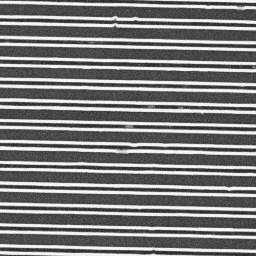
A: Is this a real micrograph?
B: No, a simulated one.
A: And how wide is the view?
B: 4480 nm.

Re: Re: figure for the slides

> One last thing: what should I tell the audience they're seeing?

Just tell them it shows parallel lines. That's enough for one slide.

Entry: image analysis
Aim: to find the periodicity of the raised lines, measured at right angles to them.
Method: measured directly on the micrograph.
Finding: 365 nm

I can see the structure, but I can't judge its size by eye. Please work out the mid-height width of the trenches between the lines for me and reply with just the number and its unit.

236 nanometres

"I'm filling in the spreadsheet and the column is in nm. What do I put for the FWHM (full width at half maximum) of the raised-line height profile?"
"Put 131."